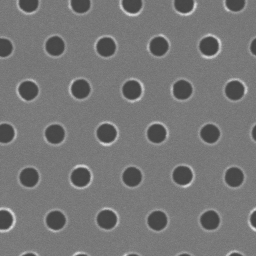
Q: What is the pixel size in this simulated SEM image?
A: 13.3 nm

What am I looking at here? a regular array of holes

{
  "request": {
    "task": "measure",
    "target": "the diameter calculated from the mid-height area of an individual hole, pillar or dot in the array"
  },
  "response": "0.266 um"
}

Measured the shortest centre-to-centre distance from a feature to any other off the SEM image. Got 661 nm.